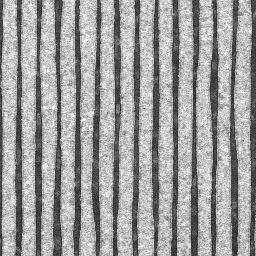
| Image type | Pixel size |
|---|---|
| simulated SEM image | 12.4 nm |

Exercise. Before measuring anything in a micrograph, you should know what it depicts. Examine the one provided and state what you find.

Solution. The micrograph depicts parallel lines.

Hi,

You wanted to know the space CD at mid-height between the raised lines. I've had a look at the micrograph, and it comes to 72.8 nm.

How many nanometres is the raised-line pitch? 242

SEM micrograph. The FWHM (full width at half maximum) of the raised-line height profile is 0.157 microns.